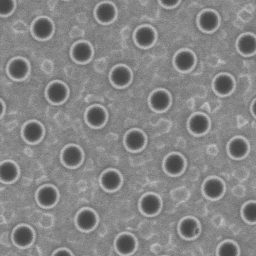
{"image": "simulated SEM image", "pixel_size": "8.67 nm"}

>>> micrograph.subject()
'a regular array of raised bodies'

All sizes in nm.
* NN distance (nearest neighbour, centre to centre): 396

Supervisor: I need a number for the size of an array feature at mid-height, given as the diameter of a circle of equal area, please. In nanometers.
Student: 201